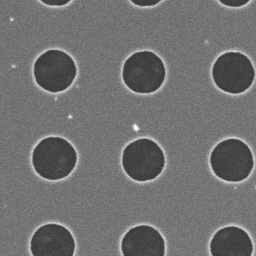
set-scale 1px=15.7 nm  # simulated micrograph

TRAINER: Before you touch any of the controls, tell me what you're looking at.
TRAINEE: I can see holes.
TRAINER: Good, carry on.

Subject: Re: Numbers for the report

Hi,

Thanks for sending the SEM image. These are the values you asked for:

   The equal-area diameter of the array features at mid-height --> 676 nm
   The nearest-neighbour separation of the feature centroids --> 1.38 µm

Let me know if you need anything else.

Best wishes